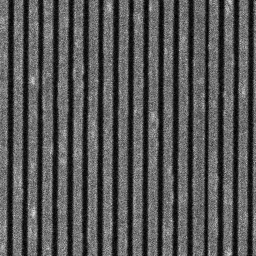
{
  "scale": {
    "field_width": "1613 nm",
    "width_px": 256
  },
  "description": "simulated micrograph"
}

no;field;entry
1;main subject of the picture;parallel lines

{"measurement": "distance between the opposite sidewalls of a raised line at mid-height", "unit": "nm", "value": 56.7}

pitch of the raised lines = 94.6 nm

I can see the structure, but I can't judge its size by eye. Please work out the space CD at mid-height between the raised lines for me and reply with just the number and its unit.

33.9 nm